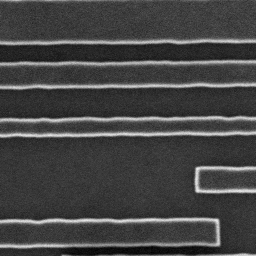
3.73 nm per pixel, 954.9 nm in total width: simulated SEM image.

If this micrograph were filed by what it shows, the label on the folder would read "groups of lines, slits or small figures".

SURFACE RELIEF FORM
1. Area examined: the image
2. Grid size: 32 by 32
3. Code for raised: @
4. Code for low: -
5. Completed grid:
@@@@@@@@@@@@@@@@@@@@@@@@@@@@@@@@
@@@@@@@@@@@@@@@@@@@@@@@@@@@@@@@@
@@@@@@@@@@@@@@@@@@@@@@@@@@@@@@@@
@@@@@@@@@@@@@@@@@@@@@@@@@@@@@@@@
@@@@@@@@@@@@@@@@@@@@@@@@@@@@@@@@
--------------------------------
--------------------------------
--------------------------------
@@@@@@@@@@@@@@@@@@@@@@@@@@@@@@@@
@@@@@@@@@@@@@@@@@@@@@@@@@@@@@@@@
@@@@@@@@@@@@@@@@@@@@@@@@@@@@@@@@
--------------------------------
--------------------------------
--------------------------------
--------------------------------
@@@@@@@@@@@@@@@@@@@@@@@@@@@@@@@@
@@@@@@@@@@@@@@@@@@@@@@@@@@@@@@@@
--------------------------------
--------------------------------
--------------------------------
--------------------------------
-------------------------@@@@@@@
-------------------------@@@@@@@
-------------------------@@@@@@@
--------------------------------
--------------------------------
--------------------------------
----------------------@@@@------
@@@@@@@@@@@@@@@@@@@@@@@@@@@-----
@@@@@@@@@@@@@@@@@@@@@@@@@@@-----
@@@@@@@@@@@@@@@@@@@@@@@@@@@-----
--------------------------------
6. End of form